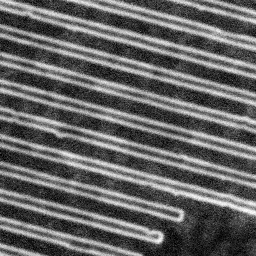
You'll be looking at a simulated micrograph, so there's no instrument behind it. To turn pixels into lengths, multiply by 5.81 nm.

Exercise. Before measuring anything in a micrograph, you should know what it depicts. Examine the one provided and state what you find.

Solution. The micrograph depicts parallel lines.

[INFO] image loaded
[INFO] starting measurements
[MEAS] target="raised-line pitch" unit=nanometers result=154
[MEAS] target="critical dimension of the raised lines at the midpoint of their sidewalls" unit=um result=0.0512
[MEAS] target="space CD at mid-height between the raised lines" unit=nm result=102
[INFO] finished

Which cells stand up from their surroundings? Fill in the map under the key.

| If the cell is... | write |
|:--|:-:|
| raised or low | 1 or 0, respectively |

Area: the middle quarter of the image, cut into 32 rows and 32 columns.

00000000000011111111100000000000
00000000000000001111111100000000
11100000000000000000111111110000
11111110000000000000000011111111
00111111100000000000000000011111
00000011111111000000000000000001
00000000001111111100000000000000
00000000000001111111100000000000
00000000000000000111111100000000
11110000000000000000011111110000
11111110000000000000000011111111
00011111111000000000000000011111
00000001111111100000000000000000
00000000001111111110000000000000
00000000000000111111110000000000
10000000000000000111111111000000
11110000000000000000011111111100
11111111000000000000000011111111
00001111111100000000000000000111
00000001111111110000000000000000
00000000001111111110000000000000
00000000000000111111111000000000
10000000000000000011111111100000
11110000000000000000011111111110
11111111000000000000000001111111
00001111111100000000000000000111
00000001111111110000000000000000
00000000000111111110000000000000
00000000000000011111111000000000
10000000000000000001111111110000
11111000000000000000000111111110
01111111100000000000000000111111